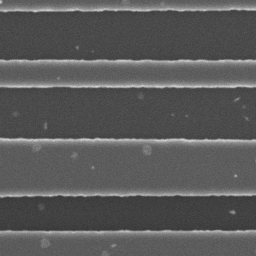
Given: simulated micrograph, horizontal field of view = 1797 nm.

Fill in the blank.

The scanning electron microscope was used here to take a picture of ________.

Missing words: lines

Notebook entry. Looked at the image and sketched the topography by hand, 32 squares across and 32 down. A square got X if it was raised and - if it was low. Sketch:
XXXXXXXXXXXXXXXXXXXXXXXXXXXXXXXX
--------------------------------
--------------------------------
--------------------------------
--------------------------------
--------------------------------
--------------------------------
--------------------------------
XXXXXXXXXXXXXXXXXXXXXXXXXXXXXXXX
XXXXXXXXXXXXXXXXXXXXXXXXXXXXXXXX
XXXXXXXXXXXXXXXXXXXXXXXXXXXXXXXX
--------------------------------
--------------------------------
--------------------------------
--------------------------------
--------------------------------
--------------------------------
XXX--X----XXXXX-X-----X---------
XXXXXXXXXXXXXXXXXXXXXXXXXXXXXXXX
XXXXXXXXXXXXXXXXXXXXXXXXXXXXXXXX
XXXXXXXXXXXXXXXXXXXXXXXXXXXXXXXX
XXXXXXXXXXXXXXXXXXXXXXXXXXXXXXXX
XXXXXXXXXXXXXXXXXXXXXXXXXXXXXXXX
XXXXXXXXXXXXXXXXXXXXXXXXXXXXXXXX
XXXX--X--------X----------------
--------------------------------
--------------------------------
--------------------------------
--------------------------------
XXXXXXXXXXXXXXXXXXXXXXXXXXXXXXXX
XXXXXXXXXXXXXXXXXXXXXXXXXXXXXXXX
XXXXXXXXXXXXXXXXXXXXXXXXXXXXXXXX